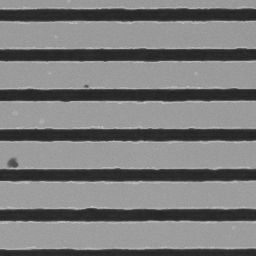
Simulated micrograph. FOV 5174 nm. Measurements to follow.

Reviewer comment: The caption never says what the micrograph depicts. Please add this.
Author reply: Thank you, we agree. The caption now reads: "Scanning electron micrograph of parallel lines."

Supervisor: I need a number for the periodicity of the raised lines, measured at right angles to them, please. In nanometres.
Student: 809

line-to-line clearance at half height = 210 nanometers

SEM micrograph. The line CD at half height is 599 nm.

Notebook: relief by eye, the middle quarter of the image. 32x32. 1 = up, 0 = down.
11111111111111111111111111111111
11111111111111111111111111111111
11111111111111111111111111111111
11111111111111111111111111111111
11111111111111111111111111111111
11111111111111111111111111111111
00110000000000011110011011111100
00000000000000000000000000000000
00000000000000000000000000000000
11111111111111111111111111111111
11111111111111111111111111111111
11111111111111111111111111111111
11111111111111111111111111111111
11111111111111111111111111111111
11111111111111111111111111111111
11111111111111111111111111111111
11000000001000001000000000000000
00000000000000000000000000000000
00000000000000000000000000000000
11111111111111111111111111111111
11111111111111111111111111111111
11111111111111111111111111111111
11111111111111111111111111111111
11111111111111111111111111111111
11111111111111111111111111111111
11111111111111111111111111111111
11111110010100110000000000000000
00000000000000000000000000000000
00000000000000000000000000000000
11111111111111111111111111111111
11111111111111111111111111111111
11111111111111111111111111111111